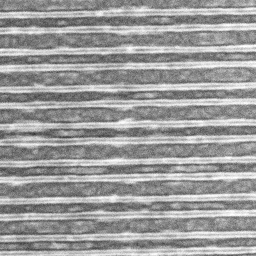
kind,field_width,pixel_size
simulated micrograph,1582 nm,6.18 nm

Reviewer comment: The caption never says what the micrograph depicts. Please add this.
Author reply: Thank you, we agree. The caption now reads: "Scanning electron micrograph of parallel lines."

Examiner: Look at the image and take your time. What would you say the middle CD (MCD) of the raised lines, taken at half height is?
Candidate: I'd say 34.8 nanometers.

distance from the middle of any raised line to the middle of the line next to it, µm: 0.114